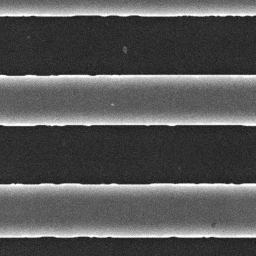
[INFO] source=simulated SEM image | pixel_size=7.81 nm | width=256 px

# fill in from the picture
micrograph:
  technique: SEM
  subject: lines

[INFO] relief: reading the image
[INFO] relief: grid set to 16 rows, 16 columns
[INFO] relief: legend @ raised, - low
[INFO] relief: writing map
@@@@@@@@@@@@@@@@
----------------
----------------
----------------
----------------
@@@@@@@@@@@@@@@@
@@@@@@@@@@@@@@@@
@@@@@@@@@@@@@@@@
----------------
----------------
----------------
----------------
@@@@@@@@@@@@@@@@
@@@@@@@@@@@@@@@@
@@@@@@@@@@@@@@@@
----------------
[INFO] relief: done